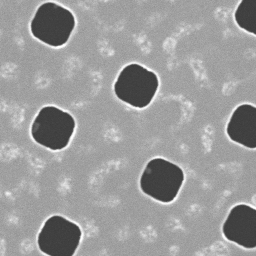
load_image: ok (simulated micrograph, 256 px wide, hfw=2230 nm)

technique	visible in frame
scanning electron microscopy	holes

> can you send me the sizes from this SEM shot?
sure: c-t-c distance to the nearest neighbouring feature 0.833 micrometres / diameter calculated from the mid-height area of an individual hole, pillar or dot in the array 371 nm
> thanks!